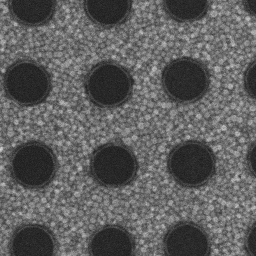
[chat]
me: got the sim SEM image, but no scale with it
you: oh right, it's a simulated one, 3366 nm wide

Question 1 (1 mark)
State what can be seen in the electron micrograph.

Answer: raised bodies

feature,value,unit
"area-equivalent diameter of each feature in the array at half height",42.6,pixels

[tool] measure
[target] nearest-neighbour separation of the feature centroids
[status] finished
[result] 1020 nm